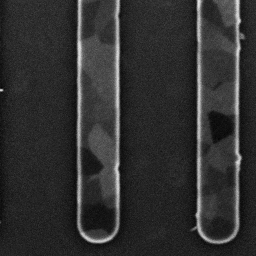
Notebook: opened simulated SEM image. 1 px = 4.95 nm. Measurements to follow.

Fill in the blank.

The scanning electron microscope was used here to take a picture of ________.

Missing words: one or a few lines or trenches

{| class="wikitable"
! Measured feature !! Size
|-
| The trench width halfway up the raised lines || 396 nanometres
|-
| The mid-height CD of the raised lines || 0.196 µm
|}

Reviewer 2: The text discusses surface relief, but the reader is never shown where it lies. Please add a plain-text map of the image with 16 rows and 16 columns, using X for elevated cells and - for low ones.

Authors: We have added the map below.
-----XX-----XXX-
-----XX-----XXX-
-----XX-----XXX-
-----XX-----XXX-
-----XX-----XXX-
-----XX-----XXX-
-----XX-----XXX-
-----XX-----XXX-
-----XX-----XXX-
-----XX-----XXX-
-----XX-----XXX-
-----XX-----XXX-
-----XX-----XXX-
-----XX-----XXX-
-----XX------XX-
----------------